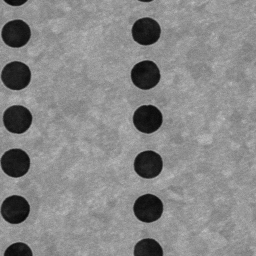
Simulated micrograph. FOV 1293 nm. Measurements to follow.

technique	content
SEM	a regular array of holes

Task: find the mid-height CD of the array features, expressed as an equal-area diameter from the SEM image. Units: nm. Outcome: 150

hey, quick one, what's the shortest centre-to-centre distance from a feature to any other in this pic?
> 220 nm